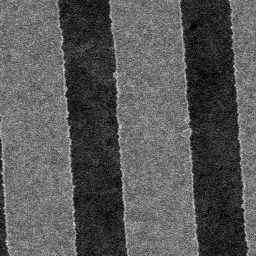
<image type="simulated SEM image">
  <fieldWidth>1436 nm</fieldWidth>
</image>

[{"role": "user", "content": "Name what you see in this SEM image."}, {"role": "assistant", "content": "one or a few lines or trenches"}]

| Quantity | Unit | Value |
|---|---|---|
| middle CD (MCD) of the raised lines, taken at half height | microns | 0.378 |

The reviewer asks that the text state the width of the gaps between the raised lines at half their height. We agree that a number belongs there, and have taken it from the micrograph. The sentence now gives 284 nanometers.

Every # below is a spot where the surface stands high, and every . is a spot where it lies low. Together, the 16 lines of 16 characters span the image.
####...####...##
####...####....#
####...####....#
####...####....#
####...#####...#
####...#####...#
####...#####...#
####...#####...#
####...#####...#
####....####...#
####....####...#
####....####...#
#####...####...#
#####...####...#
.####...####...#
.####...####....